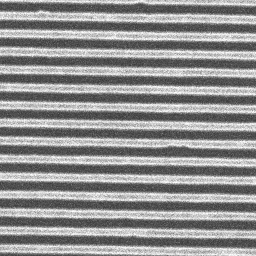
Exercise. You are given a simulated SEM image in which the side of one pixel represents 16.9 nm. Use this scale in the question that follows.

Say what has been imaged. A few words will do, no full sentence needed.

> parallel lines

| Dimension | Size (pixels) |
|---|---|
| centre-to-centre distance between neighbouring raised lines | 17.9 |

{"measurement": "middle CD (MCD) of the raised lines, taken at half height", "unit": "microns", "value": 0.137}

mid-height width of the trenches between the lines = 168 nm